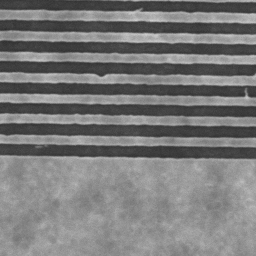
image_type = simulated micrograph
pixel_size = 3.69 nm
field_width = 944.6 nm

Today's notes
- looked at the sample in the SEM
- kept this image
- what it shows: parallel lines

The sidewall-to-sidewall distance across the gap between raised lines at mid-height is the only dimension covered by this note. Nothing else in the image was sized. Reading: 0.0438 micrometres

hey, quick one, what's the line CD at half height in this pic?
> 0.0332 micrometres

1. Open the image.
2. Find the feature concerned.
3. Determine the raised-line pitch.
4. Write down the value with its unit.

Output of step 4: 20.8 px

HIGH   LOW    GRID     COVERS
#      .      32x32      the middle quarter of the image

................................
................................
###.###.........................
################################
################################
................................
................................
................................
################################
################################
................................
................................
................................
################################
################################
................................
................................
................................
################################
################################
.....................##.........
................................
................................
###################.............
################################
################################
################################
################################
################################
################################
################################
################################